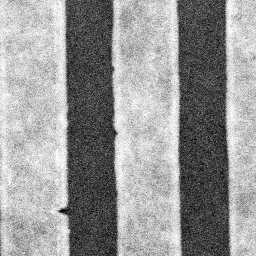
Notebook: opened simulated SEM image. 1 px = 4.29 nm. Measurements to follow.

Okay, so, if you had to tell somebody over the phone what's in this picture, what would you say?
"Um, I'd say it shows one or a few lines or trenches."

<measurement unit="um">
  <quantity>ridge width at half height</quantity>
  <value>0.261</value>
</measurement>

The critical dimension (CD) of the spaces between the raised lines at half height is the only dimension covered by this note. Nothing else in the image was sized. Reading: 0.228 micrometres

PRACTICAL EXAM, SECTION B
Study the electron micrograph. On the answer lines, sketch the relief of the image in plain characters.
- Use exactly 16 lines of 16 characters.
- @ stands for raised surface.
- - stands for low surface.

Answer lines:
@@@@---@@@@---@@
@@@@---@@@@---@@
@@@@---@@@@---@@
@@@@---@@@@---@@
@@@@---@@@@---@@
@@@@---@@@@---@@
@@@@---@@@@---@@
@@@@---@@@@---@@
@@@@---@@@@---@@
@@@@---@@@@---@@
@@@@---@@@@---@@
@@@@---@@@@---@@
@@@@---@@@@---@@
@@@@---@@@@----@
@@@@---@@@@----@
@@@@---@@@@---@@